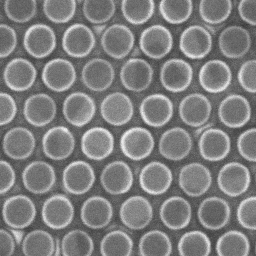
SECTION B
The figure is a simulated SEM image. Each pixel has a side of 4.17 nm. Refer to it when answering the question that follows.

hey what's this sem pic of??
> a regular array of raised bodies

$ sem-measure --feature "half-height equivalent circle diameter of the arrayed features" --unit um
0.131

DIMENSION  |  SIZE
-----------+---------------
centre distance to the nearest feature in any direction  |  160 nm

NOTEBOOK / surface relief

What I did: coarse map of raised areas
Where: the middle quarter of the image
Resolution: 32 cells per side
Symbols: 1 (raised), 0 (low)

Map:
11000111111100011111100001111110
11000111111100111111110011111111
11100111111100111111110011111111
11100111111100111111110011111111
11000111111100011111110011111110
10000011111000011111100001111110
00000001110000000110000000011000
00111000000011000000000000000000
01111100000111110000011111000001
11111110001111111000111111000011
11111110011111111001111111100111
11111110011111111001111111100111
11111110011111111001111111100111
01111110001111110000111111000011
01111100000111110000011111000011
00000000000000000000000000000000
10000001110000000111000000011100
11000111111000011111100001111110
11000111111100011111110011111110
11000111111100111111110011111111
11000111111100011111110011111111
11000111111100011111110011111110
11000111111000011111100011111110
00000001110000000111000000111100
00011000000000000000000000000000
01111100000111110000011110000001
11111110001111110000111111000011
11111110011111111001111111100111
11111110011111111001111111100111
11111110011111111001111111100111
11111110001111111000111111000111
01111100001111110000111110000011